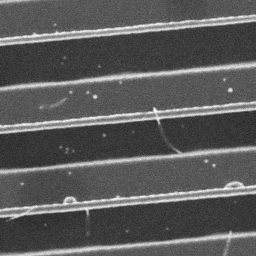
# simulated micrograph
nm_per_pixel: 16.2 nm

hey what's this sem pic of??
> lines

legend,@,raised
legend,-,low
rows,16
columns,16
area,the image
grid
@@@@@@@@@@@@@@@@
@@@@@@@@@@@@@@--
@@@-------------
----------------
-----------@@@@@
-@@@@@@@@@@@@@@@
@@@@@@@@@@@@@@@@
@@@@@@@@@-------
----------------
--------------@@
---@@@@@@@@@@@@@
@@@@@@@@@@@@@@@@
@@@@@@@@@@@-----
@---------------
----------------
-------@@@@@@@@@